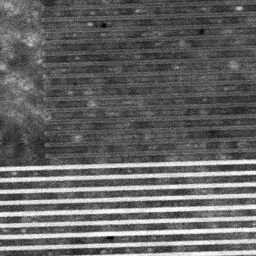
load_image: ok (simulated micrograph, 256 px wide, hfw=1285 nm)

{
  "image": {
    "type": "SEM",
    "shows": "parallel lines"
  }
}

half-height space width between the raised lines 0.0414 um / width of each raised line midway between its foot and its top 0.0138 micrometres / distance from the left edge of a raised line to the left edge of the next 57.1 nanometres